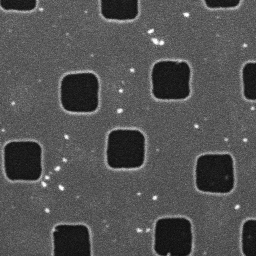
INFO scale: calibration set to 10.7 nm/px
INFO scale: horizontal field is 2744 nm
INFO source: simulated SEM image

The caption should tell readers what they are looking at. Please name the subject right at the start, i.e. holes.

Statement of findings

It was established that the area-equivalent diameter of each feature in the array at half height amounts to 42.2 px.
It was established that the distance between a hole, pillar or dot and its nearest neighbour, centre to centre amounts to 82.3 px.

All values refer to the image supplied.